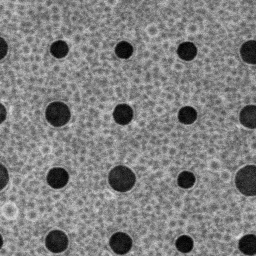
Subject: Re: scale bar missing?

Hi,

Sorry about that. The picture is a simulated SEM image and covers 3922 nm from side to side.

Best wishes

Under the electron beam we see a regular array of holes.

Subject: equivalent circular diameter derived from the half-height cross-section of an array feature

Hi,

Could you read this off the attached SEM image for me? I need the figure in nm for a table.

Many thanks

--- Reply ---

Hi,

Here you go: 321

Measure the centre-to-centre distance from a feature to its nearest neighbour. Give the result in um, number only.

0.984